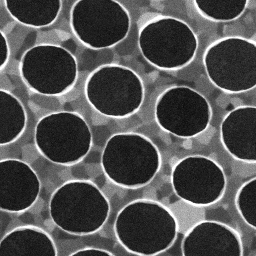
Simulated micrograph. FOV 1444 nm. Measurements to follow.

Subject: a regular array of holes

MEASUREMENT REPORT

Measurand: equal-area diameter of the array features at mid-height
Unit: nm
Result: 301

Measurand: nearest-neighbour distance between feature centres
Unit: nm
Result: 395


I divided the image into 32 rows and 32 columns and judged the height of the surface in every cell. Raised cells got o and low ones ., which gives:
o.......oo.....oooooooooo......o
o......oo.......ooooooooo.....oo
oo.....oo.......oooo..ooooo..ooo
ooooooooo.......oo......oooooooo
oooooooooo......oo......oooooooo
.oooooooooo...ooo........oo.....
.oo.....oooooooooo......oo......
.oo......oooooooooo.....oo......
ooo.......ooo...oooo.ooooo......
ooo......oo......ooooooooo......
ooo......oo.......ooooooooo.....
.oooo...ooo.......ooo...oooooooo
..ooooooooo.......oo......oooooo
...ooooooooo.....ooo......oooo..
...ooo....oooo.ooooo......ooo...
...oo......ooooooooo......oo....
...oo......oooooooooo....ooo....
..ooo......ooo....oooooooooo....
ooooo......oo......ooooooooo....
oooooo....ooo.......ooooooooo...
...oooooooooo.......oo.....ooooo
....ooooooooo.......oo......oooo
.....ooooooooo.....ooo......oooo
.....ooo....oooooooooo......oo..
.....oo......ooooooooo......oo..
....oo........oo....ooooo.oooo..
oooooo........o......ooooooooo..
ooooooo......oo.......ooooooooo.
ooo.oooo....oo........oo.....ooo
o.....ooooooooo.......o.......oo
.......oooooooo......oo.......oo
.......ooo...oooo...ooo.......oo